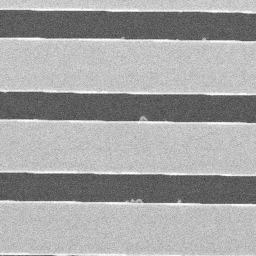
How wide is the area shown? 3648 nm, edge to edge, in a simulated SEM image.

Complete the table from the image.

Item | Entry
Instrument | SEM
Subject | lines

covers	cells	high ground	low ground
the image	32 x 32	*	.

********************************
..............................**
................................
................................
................................
********************************
********************************
********************************
********************************
********************************
********************************
.........***********************
................................
................................
................................
********************************
********************************
********************************
********************************
********************************
********************************
....****************************
................................
................................
................................
*************************.......
********************************
********************************
********************************
********************************
********************************
********************************